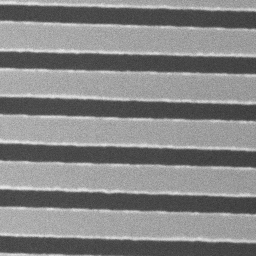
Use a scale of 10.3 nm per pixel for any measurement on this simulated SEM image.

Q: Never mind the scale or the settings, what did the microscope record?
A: lines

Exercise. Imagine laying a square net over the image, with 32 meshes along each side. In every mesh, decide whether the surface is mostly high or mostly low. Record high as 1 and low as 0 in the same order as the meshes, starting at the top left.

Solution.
11111111111111111111111111111111
00000000000000000000000000000000
00000000000000000000000000000000
11111111111111111111111110000000
11111111111111111111111111111111
11111111111111111111111111111111
00000011111111111111111111111111
00000000000000000000000000000000
00000000000000000000000000000000
11111111111111111111111111111111
11111111111111111111111111111111
11111111111111111111111111111111
00000000000000011111111111111111
00000000000000000000000000000000
11110000000000000000000000000000
11111111111111111111111111111111
11111111111111111111111111111111
11111111111111111111111111111111
00000000000000000000111111111111
00000000000000000000000000000000
11111111111100000000000000000000
11111111111111111111111111111111
11111111111111111111111111111111
11111111111111111111111111111111
00000000000000000000000000001111
00000000000000000000000000000000
11111111111111111101000000000000
11111111111111111111111111111111
11111111111111111111111111111111
01111111111111111111111111111111
00000000000000000000000000000000
00000000000000000000000000000000